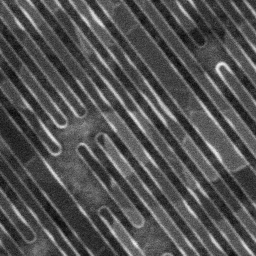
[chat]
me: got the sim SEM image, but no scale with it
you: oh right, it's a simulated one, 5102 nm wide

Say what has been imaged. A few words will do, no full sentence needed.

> groups of lines, slits or small figures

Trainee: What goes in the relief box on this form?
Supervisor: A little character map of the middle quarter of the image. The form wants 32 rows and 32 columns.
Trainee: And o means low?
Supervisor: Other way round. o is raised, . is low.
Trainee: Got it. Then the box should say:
oooo...oooo...ooo....oooooo...oo
.oooo...oooo...ooo...ooooooo...o
..oooo...ooo....ooo...ooooooo...
...ooo....ooo...oooo...ooooooo..
....ooo...oooo...ooo....oooooo..
o...oooo...oooo...ooo...ooooooo.
oo...ooo....oooo...ooo...ooooooo
ooo...ooo....ooo....ooo...oooooo
ooo...oooo....ooo...ooo....ooooo
oooo...oooo...oooo...ooo....oooo
.oooo...oooo...ooo....ooo...oooo
..oooo...ooo....ooo....oo....ooo
...ooo...oooo...oooo....oo....oo
..........oooo...oooo...ooo....o
o..........oooo...oooo...ooo....
............oooo...oooo...ooo...
.............ooo....ooo...oooo..
........oo...oooo...oooo...oooo.
........ooo...oooo...oooo...oooo
........oooo...oooo...ooo....ooo
....o....oooo...ooo....ooo...ooo
...ooo....ooo...oooo....ooo...oo
....ooo....ooo...oooo...oooo...o
....oooo...oooo...ooo....ooo....
.....oooo...oooo...ooo....ooo...
......oooo...ooo....ooo....ooo..
.......ooo....ooo....ooo...oooo.
........ooo...oooo...oooo...oooo
........oooo...oooo...oooo...ooo
.........oooo...oooo...oooo..ooo
..........oooo...ooo....ooo...oo
o..........ooo...oooo...oooo...o